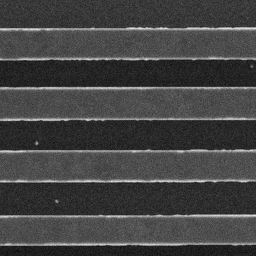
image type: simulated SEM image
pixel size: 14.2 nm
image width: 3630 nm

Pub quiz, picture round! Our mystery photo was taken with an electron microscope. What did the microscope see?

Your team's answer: lines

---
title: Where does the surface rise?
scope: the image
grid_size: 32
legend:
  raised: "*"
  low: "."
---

................................
................................
................................
................................
********************************
********************************
********************************
................................
................................
................................
................................
********************************
********************************
********************************
********************************
................................
................................
................................
................................
********************************
********************************
********************************
********************************
................................
................................
................................
................................
********************************
********************************
********************************
********************************
................................